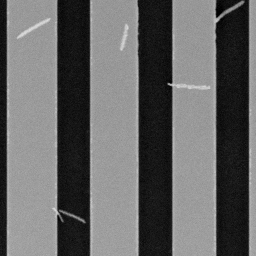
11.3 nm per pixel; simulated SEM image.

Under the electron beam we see lines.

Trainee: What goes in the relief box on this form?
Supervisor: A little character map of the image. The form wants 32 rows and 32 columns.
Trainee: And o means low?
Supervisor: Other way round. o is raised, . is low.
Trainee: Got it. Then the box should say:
.oooooo....oooooo.....ooooo....o
.oooooo....oooooo.....ooooo....o
.oooooo....oooooo.....ooooo....o
.oooooo....oooooo.....ooooo....o
.oooooo....oooooo.....ooooo....o
.oooooo....oooooo.....ooooo....o
.oooooo....oooooo.....ooooo....o
.oooooo....oooooo.....ooooo....o
.oooooo....oooooo.....ooooo....o
.oooooo....oooooo.....ooooo....o
.oooooo....oooooo....oooooo....o
.oooooo....oooooo.....ooooo....o
.oooooo....oooooo.....ooooo....o
.oooooo....oooooo.....ooooo....o
.oooooo....oooooo.....ooooo....o
.oooooo....oooooo.....ooooo....o
.oooooo....oooooo.....ooooo....o
.oooooo....oooooo.....ooooo....o
.oooooo....oooooo.....ooooo....o
.oooooo....oooooo.....ooooo....o
.oooooo....oooooo.....ooooo....o
.oooooo....oooooo.....ooooo....o
.oooooo....oooooo.....ooooo....o
.oooooo....oooooo.....ooooo....o
.oooooo....oooooo.....ooooo....o
.oooooo....oooooo.....ooooo....o
.oooooo....oooooo.....ooooo....o
.oooooo....oooooo.....ooooo....o
.oooooo....oooooo.....ooooo....o
.oooooo....oooooo.....ooooo....o
.oooooo....oooooo.....ooooo....o
.oooooo....oooooo.....ooooo....o